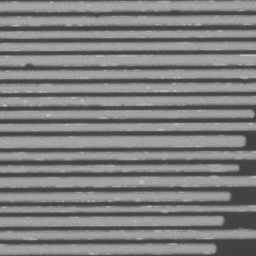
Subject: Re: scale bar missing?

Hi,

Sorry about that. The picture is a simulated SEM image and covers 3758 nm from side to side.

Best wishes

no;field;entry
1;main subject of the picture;parallel lines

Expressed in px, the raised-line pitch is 13.4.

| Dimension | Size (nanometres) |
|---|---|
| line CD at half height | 91.7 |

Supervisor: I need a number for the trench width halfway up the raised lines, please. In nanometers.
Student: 106